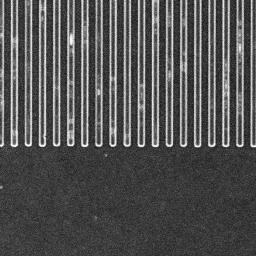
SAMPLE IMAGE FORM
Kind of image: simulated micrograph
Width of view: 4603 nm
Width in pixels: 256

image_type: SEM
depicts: parallel lines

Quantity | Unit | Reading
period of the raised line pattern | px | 14.1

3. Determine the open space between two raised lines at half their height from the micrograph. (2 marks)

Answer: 142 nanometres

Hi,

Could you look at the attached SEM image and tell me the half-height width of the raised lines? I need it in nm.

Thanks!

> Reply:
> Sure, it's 110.